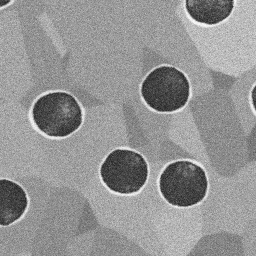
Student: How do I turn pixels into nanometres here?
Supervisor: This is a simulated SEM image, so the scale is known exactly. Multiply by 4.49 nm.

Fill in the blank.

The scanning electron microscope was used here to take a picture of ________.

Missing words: holes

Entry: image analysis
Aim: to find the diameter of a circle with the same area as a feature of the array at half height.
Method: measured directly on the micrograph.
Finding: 218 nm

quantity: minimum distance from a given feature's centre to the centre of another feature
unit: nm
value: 334